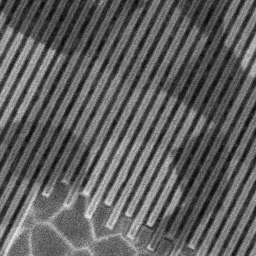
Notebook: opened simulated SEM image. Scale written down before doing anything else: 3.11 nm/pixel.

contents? parallel lines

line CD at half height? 18.7 nm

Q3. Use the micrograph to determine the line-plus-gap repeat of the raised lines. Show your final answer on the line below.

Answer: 36.7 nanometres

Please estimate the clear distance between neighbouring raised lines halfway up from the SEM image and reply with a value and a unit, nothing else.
5.24 px